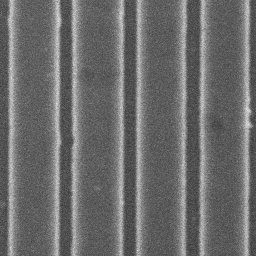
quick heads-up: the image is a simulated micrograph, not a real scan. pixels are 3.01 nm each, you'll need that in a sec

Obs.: one or a few lines or trenches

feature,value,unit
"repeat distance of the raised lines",191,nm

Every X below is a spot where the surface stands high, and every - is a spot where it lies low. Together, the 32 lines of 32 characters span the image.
-XXXXXX--XXXXXX--XXXXXX--XXXXXX-
-XXXXXX--XXXXXX--XXXXXX--XXXXXX-
-XXXXXXX-XXXXXX--XXXXXX--XXXXXX-
-XXXXXX--XXXXXX--XXXXXX--XXXXXX-
-XXXXXX--XXXXXX--XXXXXX--XXXXXX-
-XXXXXX--XXXXXX--XXXXXX--XXXXXX-
-XXXXXX--XXXXXX--XXXXXX--XXXXXX-
-XXXXXX--XXXXXX--XXXXXX--XXXXXX-
-XXXXXX--XXXXXX--XXXXXX--XXXXXX-
-XXXXXX--XXXXXX--XXXXXX--XXXXXX-
-XXXXXX--XXXXXX--XXXXXX--XXXXXX-
-XXXXXX--XXXXXX--XXXXXX--XXXXXX-
-XXXXXX--XXXXXX--XXXXXX--XXXXXX-
-XXXXXX--XXXXXX--XXXXXX--XXXXXX-
-XXXXXX--XXXXXX--XXXXXX--XXXXXX-
-XXXXXX--XXXXXX--XXXXXX--XXXXXX-
-XXXXXX--XXXXXX--XXXXXX--XXXXXX-
-XXXXXXX-XXXXXX--XXXXXX--XXXXXX-
-XXXXXX--XXXXXX--XXXXXX--XXXXXX-
-XXXXXX--XXXXXX--XXXXXX--XXXXXX-
-XXXXXX--XXXXXX--XXXXXX--XXXXXX-
-XXXXXX--XXXXXX--XXXXXX--XXXXXX-
-XXXXXX--XXXXXX--XXXXXX--XXXXXX-
-XXXXXX--XXXXXX--XXXXXX--XXXXXX-
-XXXXXX--XXXXXX--XXXXXX--XXXXXX-
-XXXXXX--XXXXXX--XXXXXX--XXXXXX-
-XXXXXX--XXXXXX--XXXXXX--XXXXXX-
-XXXXXX--XXXXXX--XXXXXX--XXXXXX-
-XXXXXX--XXXXXX--XXXXXX--XXXXXX-
-XXXXXX--XXXXXX--XXXXXX--XXXXXX-
-XXXXXX--XXXXXX--XXXXXX--XXXXXX-
-XXXXXX--XXXXXX--XXXXXX--XXXXXX-